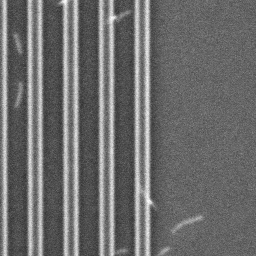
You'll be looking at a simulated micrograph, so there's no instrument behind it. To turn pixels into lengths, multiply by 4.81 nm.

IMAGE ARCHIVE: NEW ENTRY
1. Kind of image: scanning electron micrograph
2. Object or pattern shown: parallel lines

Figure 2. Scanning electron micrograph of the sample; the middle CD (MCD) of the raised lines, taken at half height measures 55.3 nm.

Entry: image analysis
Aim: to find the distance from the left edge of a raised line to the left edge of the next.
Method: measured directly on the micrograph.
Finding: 172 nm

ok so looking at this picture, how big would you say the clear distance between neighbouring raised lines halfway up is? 114 nanometres